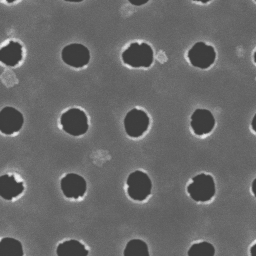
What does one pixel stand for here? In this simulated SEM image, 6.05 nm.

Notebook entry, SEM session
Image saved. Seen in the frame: a regular array of holes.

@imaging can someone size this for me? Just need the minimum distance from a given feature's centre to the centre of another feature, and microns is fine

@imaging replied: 0.379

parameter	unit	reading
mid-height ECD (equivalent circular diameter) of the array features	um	0.161